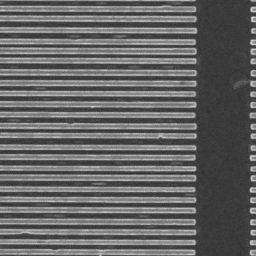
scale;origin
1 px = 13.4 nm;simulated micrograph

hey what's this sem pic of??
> parallel lines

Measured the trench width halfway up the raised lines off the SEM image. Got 0.0721 microns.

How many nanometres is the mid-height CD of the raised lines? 70.4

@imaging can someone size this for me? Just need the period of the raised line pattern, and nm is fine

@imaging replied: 142